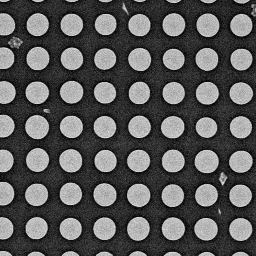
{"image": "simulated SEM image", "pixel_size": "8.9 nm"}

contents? an array of small figures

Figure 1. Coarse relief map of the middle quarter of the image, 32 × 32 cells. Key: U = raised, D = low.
UUUUDDDDUUUUDDDDDUUUUDDDDUUUUUDD
DDDDDDDDDDDDDDDDDDUUDDDDDDDDDDDD
DDDDDDDDDDDDDDDDDDDDDDDDDDDDDDDD
DDDDDDDDDDDDDDDDDDDDDDDDDDDDDDDD
DUUDDDDDDDDDDDDDDDDDDDDDDDDDDDDD
UUUUDDDDUUUUDDDDDUUUUDDDDUUUUDDD
UUUUUDDDUUUUUDDDUUUUUDDDDUUUUUDD
UUUUUDDDUUUUUDDDUUUUUDDDDUUUUUDD
UUUUDDDDUUUUUDDDUUUUUDDDDUUUUUDD
DUUDDDDDDUUDDDDDDUUUDDDDDDUUUDDD
DDDDDDDDDDDDDDDDDDDDDDDDDDDDDDDD
DDDDDDDDDDDDDDDDDDDDDDDDDDDDDDDD
DDDDDDDDDDDDDDDDDDDDDDDDDDDDDDDD
UUUDDDDDDUUUDDDDDUUUDDDDDDUUUDDD
UUUUDDDDUUUUUDDDUUUUUDDDDUUUUUDD
UUUUUDDDUUUUUDDDUUUUUUDDUUUUUUDD
UUUUUDDDUUUUUDDDUUUUUUDDUUUUUUDD
UUUUDDDDUUUUDDDDDUUUUDDDDUUUUDDD
DDDDDDDDDDDDDDDDDDDDDDDDDDDDDDDD
DDDDDDDDDDDDDDDDDDDDDDDDDDDDDDDD
DDDDDDDDDDDDDDDDDDDDDDDDDDDDDDDD
DUUDDDDDDDDDDDDDDDDDDDDDDDDDDDDD
UUUUDDDDUUUUDDDDDUUUUDDDDUUUUDDD
UUUUDDDDUUUUUDDDUUUUUDDDDUUUUUDD
UUUUDDDDUUUUUDDDUUUUUDDDDUUUUUDD
UUUUDDDDUUUUUDDDUUUUUDDDDUUUUUDD
UUUDDDDDDUUUDDDDDUUUDDDDDDUUUDDD
DDDDDDDDDDDDDDDDDDDDDDDDDDDDDDDD
DDDDDDDDDDDDDDDDDDDDDDDDDDDDDDDD
DDDDDDDDDDDDDDDDDDDDDDDDDDDDDDDD
UUUUDDDDUUUUDDDDDUUUDDDDDDUUUDDD
UUUUDDDDUUUUUDDDUUUUUDDDDUUUUDDD